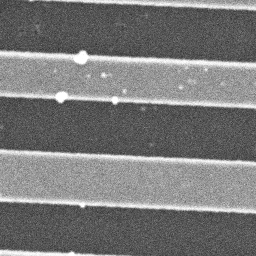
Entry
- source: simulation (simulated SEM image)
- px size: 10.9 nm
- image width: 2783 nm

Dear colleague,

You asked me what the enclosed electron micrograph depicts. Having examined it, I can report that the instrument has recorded lines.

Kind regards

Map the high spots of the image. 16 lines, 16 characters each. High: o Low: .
..............oo
................
................
oooooo..........
oooooooooooooooo
oooooooooooooooo
............oooo
................
................
ooo.............
oooooooooooooooo
oooooooooooooooo
oooooooooooooooo
................
................
................